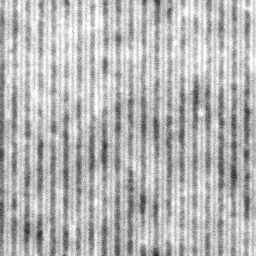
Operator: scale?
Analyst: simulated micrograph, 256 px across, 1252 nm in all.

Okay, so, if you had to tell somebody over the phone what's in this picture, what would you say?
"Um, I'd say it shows parallel lines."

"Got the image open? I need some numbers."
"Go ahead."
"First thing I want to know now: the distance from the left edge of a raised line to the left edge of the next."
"63.1 nanometers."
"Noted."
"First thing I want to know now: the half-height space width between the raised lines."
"19 nanometres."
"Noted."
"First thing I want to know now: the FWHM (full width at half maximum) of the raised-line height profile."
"44.6 nm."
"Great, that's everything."